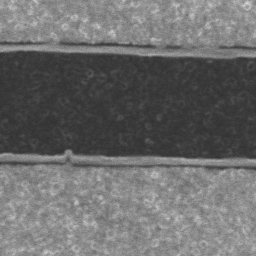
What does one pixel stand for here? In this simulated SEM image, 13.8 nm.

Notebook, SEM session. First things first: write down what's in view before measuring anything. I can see one or a few lines or trenches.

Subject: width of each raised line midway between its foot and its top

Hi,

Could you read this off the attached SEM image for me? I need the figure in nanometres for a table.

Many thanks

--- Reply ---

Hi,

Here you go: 1510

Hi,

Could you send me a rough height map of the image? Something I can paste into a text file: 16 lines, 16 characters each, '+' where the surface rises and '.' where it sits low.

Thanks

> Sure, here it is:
................
................
................
++++++++++++++++
++++++++++++++++
++++++++++++++++
++++++++++++++++
++++++++++++++++
++++++++++++++++
++++++++++++++++
................
................
................
................
................
................